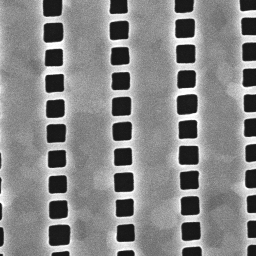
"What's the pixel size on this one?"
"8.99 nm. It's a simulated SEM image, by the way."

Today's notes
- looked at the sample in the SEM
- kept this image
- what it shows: a regular array of holes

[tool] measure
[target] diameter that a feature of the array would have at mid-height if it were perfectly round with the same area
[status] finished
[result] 188 nm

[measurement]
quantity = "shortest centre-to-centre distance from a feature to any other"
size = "227 nanometers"